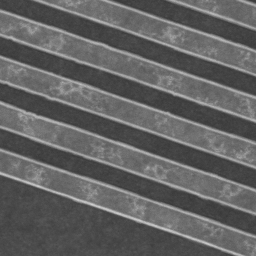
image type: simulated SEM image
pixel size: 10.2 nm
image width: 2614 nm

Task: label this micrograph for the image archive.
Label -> parallel lines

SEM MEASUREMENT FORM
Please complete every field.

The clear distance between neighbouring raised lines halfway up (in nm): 223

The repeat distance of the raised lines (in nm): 447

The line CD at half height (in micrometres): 0.225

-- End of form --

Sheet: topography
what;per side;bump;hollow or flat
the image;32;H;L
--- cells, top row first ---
LLLLLLHHHHHHHHHLLLLLLLLHHHHHHHHH
LLLLLLLLLHHHHHHHHLLLLLLLLLHHHHHH
HHHLLLLLLLLLHHHHHHHHLLLLLLLLLHHH
HHHHHHLLLLLLLLLHHHHHHHHLLLLLLLLH
HHHHHHHHHLLLLLLLLLHHHHHHHHLLLLLL
LLLHHHHHHHHHLLLLLLLLLHHHHHHHHLLL
LLLLLLHHHHHHHHHLLLLLLLLHHHHHHHHH
HLLLLLLLLHHHHHHHHHLLLLLLLLLHHHHH
HHHHLLLLLLLLLHHHHHHHHLLLLLLLLLHH
HHHHHHHLLLLLLLLHHHHHHHHHLLLLLLLL
LHHHHHHHHHLLLLLLLLHHHHHHHHHLLLLL
LLLLHHHHHHHHHLLLLLLLLHHHHHHHHHLL
LLLLLLLHHHHHHHHHLLLLLLLLHHHHHHHH
HHLLLLLLLLHHHHHHHHHLLLLLLLLHHHHH
HHHHLLLLLLLLLHHHHHHHHHLLLLLLLLHH
HHHHHHHHLLLLLLLLHHHHHHHHHLLLLLLL
LLHHHHHHHHLLLLLLLLLHHHHHHHHLLLLL
LLLLLHHHHHHHHLLLLLLLLLHHHHHHHHHL
LLLLLLLHHHHHHHHHLLLLLLLLLHHHHHHH
HHLLLLLLLLLHHHHHHHHLLLLLLLLLHHHH
HHHHHLLLLLLLLLHHHHHHHHLLLLLLLLLH
HHHHHHHHLLLLLLLLLHHHHHHHHLLLLLLL
LLLHHHHHHHHLLLLLLLLLHHHHHHHHLLLL
LLLLLHHHHHHHHHLLLLLLLLLHHHHHHHHL
LLLLLLLLHHHHHHHHHLLLLLLLLHHHHHHH
LLLLLLLLLLLHHHHHHHHHLLLLLLLLHHHH
LLLLLLLLLLLLLLHHHHHHHHHLLLLLLLLH
LLLLLLLLLLLLLLLLLHHHHHHHHHLLLLLL
LLLLLLLLLLLLLLLLLLLLHHHHHHHHHLLL
LLLLLLLLLLLLLLLLLLLLLLLHHHHHHHHH
LLLLLLLLLLLLLLLLLLLLLLLLLLHHHHHH
LLLLLLLLLLLLLLLLLLLLLLLLLLLLLHHH